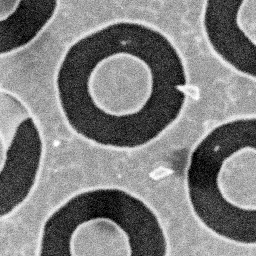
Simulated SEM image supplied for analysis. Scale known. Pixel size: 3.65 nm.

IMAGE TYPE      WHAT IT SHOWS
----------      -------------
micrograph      ring-shaped grooves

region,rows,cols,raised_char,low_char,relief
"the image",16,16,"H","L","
HLLLHHHHHHHHHLLH
LLLHHHHLLHHHHLLH
LLHHHLLLLLLHHLLL
HHHHLLLHLLLHHHLL
HHHHLLHHHLLLHHHL
HHHHLLHHHLLHHHHH
HHHHLLHHHLLHHHHH
HLHHLLLLLLLHHHHL
LLLHHLLLLLHHHLLL
LLLHHHHHHHHHLLLH
LLHHHHHHHHHHLLHH
LLHHHHHHHHHHLLHH
LHHHLLLLLHHHLLHH
HHHLLLLLLLHHLLLL
HHHLLHHHLLHHHLLL
HHLLHHHHLLHHHHHH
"